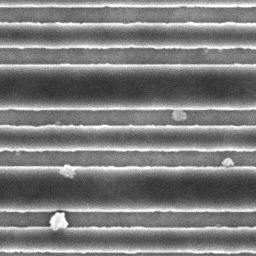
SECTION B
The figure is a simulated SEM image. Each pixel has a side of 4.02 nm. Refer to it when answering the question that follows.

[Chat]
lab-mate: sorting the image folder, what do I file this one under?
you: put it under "lines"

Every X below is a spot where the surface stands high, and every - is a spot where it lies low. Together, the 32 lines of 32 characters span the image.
XXXXXXXXXXXXXXXXXXXXXXXXXXXXXXXX
--------------------------------
--------------------------------
XXXXXXXXXXXXXXXXXXXXXXXXXXXXXXXX
XXXXXXXXXXXXXXXXXXXXXXXXXXXXXXXX
XXXXXXXXXXXXXXXXXXXXXXXXXXXXXXXX
--------------------------------
--------------------------------
XXXXXXXXXXXXXXXXXXXXXXXXXXXXXXXX
XXXXXXXXXXXXXXXXXXXXXXXXXXXXXXXX
XXXXXXXXXXXXXXXXXXXXXXXXXXXXXXXX
XXXXXXXXXXXXXXXXXXXXXXXXXXXXXXXX
XXXXXXXXXXXXXXXXXXXXXXXXXXXXXXXX
XXXXXXXXXXXXXXXXXXXXXXXXXXXXXXXX
--------------------------------
--------------------------------
XXXXXXXXXXXXXXXXXXXXXXXXXXXXXXXX
XXXXXXXXXXXXXXXXXXXXXXXXXXXXXXXX
XXXXXXXXXXXXXXXXXXXXXXXXXXXXXXXX
--------------------------------
----------------------------X---
XXXXXXXXXXXXXXXXXXXXXXXXXXXXXXXX
XXXXXXXXXXXXXXXXXXXXXXXXXXXXXXXX
XXXXXXXXXXXXXXXXXXXXXXXXXXXXXXXX
XXXXXXXXXXXXXXXXXXXXXXXXXXXXXXXX
XXXXXXXXXXXXXXXXXXXXXXXXXXXXXXXX
-------X------------------------
------XX------------------------
XX-XXXXXX-XXXXXXXX-------XXXXXXX
XXXXXXXXXXXXXXXXXXXXXXXXXXXXXXXX
XXXXXXXXXXXXXXXXXXXXXXXXXXXXXXXX
----------X----XX-------XXXXXX-X